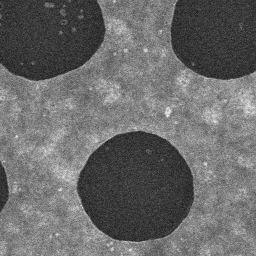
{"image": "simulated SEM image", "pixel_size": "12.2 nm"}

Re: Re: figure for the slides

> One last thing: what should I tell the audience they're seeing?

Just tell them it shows holes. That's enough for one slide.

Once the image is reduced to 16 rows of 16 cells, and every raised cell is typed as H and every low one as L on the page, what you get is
LLLLLLHHHHHLLLLL
LLLLLLLHHHHLLLLL
LLLLLLHHHHHLLLLL
LLLLLLHHHHHLLLLL
HLLLHHHHHHHHLLLL
HHHHHHHHHHHHHHHH
HHHHHHHHHHHHHHHH
HHHHHHHHHHHHHHHH
HHHHHHHLLLHHHHHH
HHHHHHLLLLLHHHHH
HHHHHLLLLLLLHHHH
HHHHHLLLLLLLHHHH
HHHHHLLLLLLLHHHH
HHHHHHLLLLLLHHHH
HHHHHHLLLLLHHHHH
HHHHHHHHHHHHHHHH